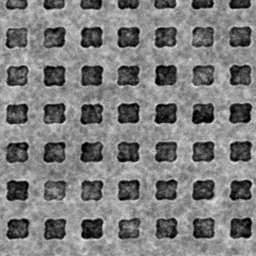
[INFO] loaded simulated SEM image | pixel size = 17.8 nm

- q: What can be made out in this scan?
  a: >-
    a regular array of holes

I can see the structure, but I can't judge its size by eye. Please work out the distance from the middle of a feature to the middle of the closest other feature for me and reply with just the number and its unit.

656 nanometers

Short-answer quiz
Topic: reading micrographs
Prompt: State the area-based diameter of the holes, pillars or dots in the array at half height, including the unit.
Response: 418 nanometers